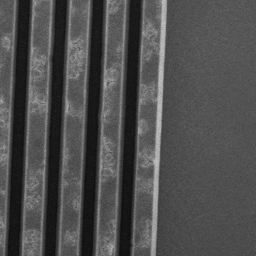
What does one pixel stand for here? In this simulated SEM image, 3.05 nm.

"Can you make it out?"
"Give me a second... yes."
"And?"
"parallel lines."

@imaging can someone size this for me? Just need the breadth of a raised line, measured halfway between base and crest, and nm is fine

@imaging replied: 67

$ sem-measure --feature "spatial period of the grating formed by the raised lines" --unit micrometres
0.113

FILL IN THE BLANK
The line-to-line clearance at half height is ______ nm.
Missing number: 45.7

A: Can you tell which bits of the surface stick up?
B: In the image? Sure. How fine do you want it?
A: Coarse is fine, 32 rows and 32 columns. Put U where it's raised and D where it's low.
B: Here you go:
UUDDUUUDDUUDDUUUDDUUUDDDDDDDDDDD
UUDDUUUDDUUDDUUUDDUUUDDDDDDDDDDD
UUDDUUUDDUUDDUUUDDUUUDDDDDDDDDDD
UUDDUUDDDUUDDUUUDDUUDDDDDDDDDDDD
UUDDUUDDDUUDDUUUDDUUDDDDDDDDDDDD
UUDDUUDDUUUDDUUUDDUUDDDDDDDDDDDD
UUDDUUDDUUUDDUUUDDUUDDDDDDDDDDDD
UUDDUUDDUUUDDUUUDDUUDDDDDDDDDDDD
UUDDUUDDUUUDDUUDDUUUDDDDDDDDDDDD
UUDDUUDDUUUDDUUDDUUUDDDDDDDDDDDD
UUDDUUDDUUUDDUUDDUUUDDDDDDDDDDDD
UUDDUUDDUUUDDUUDDUUUDDDDDDDDDDDD
UUDDUUDDUUUDDUUDDUUUDDDDDDDDDDDD
UDDUUUDDUUUDDUUDDUUUDDDDDDDDDDDD
UDDUUUDDUUUDDUUDDUUUDDDDDDDDDDDD
UDDUUUDDUUUDDUUDDUUUDDDDDDDDDDDD
UDDUUUDDUUUDDUUDDUUUDDDDDDDDDDDD
UDDUUUDDUUDDUUUDDUUUDDDDDDDDDDDD
UDDUUUDDUUUDUUUDDUUUDDDDDDDDDDDD
UDDUUUDDUUUDUUUDDUUUDDDDDDDDDDDD
UDDUUUDDUUDDUUUDDUUUDDDDDDDDDDDD
UDDUUUDDUUDDUUUDDUUUDDDDDDDDDDDD
UDDUUUDDUUDDUUUDDUUUDDDDDDDDDDDD
UDDUUUDDUUDDUUUDDUUDDDDDDDDDDDDD
UDDUUUDDUUDDUUUDDUUDDDDDDDDDDDDD
UDDUUUDDUUDDUUUDDUUDDDDDDDDDDDDD
UDDUUUDUUUDDUUUDDUUDDDDDDDDDDDDD
UDDUUUDUUUDDUUUDDUUDDDDDDDDDDDDD
UDDUUDDUUUDDUUUDDUUDDDDDDDDDDDDD
UDDUUDDUUUDDUUUDDUUDDDDDDDDDDDDD
UDDUUDDUUUDDUUUDDUUDDDDDDDDDDDDD
UDDUUDDUUUDDUUDDUUUDDDDDDDDDDDDD